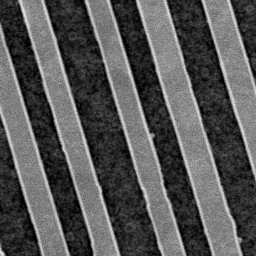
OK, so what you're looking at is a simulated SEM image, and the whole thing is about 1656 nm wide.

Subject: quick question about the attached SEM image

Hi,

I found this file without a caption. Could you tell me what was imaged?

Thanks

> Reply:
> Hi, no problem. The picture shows parallel lines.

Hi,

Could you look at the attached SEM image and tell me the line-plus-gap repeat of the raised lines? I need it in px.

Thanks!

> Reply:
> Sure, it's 56.4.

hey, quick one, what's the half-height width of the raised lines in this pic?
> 146 nm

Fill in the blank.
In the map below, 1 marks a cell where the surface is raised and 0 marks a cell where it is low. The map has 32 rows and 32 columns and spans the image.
00011000000111000111100000111000
00011100000111000011100000111000
00011100000011000011100000111000
00001100000011100011110000111100
00001110000011100001110000011100
10001110000001100001110000011100
10001110000001100001110000011110
10000110000001110001111000001110
10000111000001110000111000001110
11000111000000110000111000001110
11000011000000111000111100001111
11000011100000111000011100000111
11100011100000011000011100000111
11100011100000011100011110000111
11100001110000011100011110000011
01110001110000011100001110000011
01110001110000001100001110000011
01110000110000001110001111000001
01110000111000001110000111000001
00111000111000000110000111000001
00111000011000000111000111100001
00111000011100000111000011100000
00011100011100000111000011100000
00011100001100000011000011110000
00011100001110000011100011110000
00001110001110000011100001110000
00001110001110000001100001111000
00001110000110000001110001111000
00001110000111000001110000111000
00000111000111000000110000111000
00000111000011000000111000111100
00000111000011100000111000011100